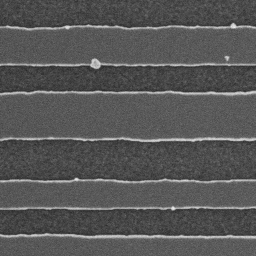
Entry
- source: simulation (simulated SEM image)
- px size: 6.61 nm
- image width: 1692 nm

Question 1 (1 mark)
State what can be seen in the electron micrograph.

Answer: lines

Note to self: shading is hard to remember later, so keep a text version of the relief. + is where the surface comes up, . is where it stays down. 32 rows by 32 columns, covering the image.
................................
................................
................................
++++++++++++++++++++++++++++++++
++++++++++++++++++++++++++++++++
++++++++++++++++++++++++++++++++
++++++++++++++++++++++++++++++++
++++++++++++++++++++++++++++++++
................................
................................
................................
............+........+..........
++++++++++++++++++++++++++++++++
++++++++++++++++++++++++++++++++
++++++++++++++++++++++++++++++++
++++++++++++++++++++++++++++++++
++++++++++++++++++++++++++++++++
..........++....+++++++++....++.
................................
................................
................................
................................
.........+..+.......+...........
++++++++++++++++++++++++++++++++
++++++++++++++++++++++++++++++++
++++++++++++++++++++++++++++++++
................................
................................
................................
+++++++++++.....................
++++++++++++++++++++++++++++++++
++++++++++++++++++++++++++++++++